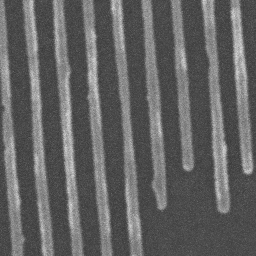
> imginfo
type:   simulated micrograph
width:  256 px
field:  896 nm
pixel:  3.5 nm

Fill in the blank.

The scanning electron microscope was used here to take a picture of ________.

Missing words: parallel lines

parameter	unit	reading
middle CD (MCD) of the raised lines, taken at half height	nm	31.4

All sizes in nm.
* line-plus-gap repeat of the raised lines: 103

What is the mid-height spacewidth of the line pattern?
72.3 nm